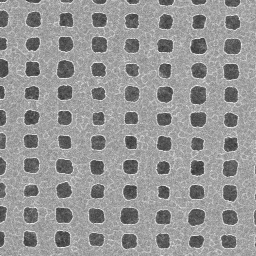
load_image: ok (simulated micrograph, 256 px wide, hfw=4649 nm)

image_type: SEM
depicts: a regular array of holes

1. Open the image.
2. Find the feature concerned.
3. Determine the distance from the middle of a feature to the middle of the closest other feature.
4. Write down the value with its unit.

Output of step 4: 436 nanometers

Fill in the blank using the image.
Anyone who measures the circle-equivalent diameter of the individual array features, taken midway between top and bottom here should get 291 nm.